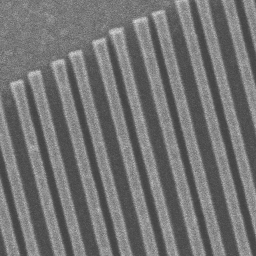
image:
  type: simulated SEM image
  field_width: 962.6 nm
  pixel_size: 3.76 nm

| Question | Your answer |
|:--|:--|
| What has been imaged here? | parallel lines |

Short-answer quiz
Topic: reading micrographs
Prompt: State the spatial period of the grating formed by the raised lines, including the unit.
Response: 84.7 nanometres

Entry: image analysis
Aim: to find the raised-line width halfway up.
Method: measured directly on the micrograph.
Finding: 46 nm